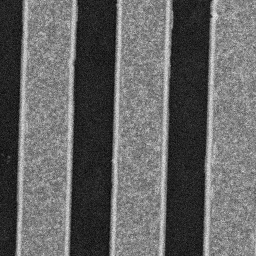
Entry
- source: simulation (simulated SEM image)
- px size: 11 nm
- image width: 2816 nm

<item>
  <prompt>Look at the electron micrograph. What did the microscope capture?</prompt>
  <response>one or a few lines or trenches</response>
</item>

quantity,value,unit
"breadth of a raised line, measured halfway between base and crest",524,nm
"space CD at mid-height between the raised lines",0.504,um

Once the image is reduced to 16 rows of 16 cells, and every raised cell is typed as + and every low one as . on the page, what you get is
..+++...++...+++
..+++...++...+++
..+++..+++...+++
..++...+++...+++
..++...+++...+++
.+++...+++...+++
.+++...+++...+++
.+++...+++...+++
.+++...+++...+++
.+++...+++...+++
.+++...+++...+++
.+++...+++...+++
.+++...+++...+++
.+++...+++...+++
.+++...+++...+++
.+++...+++...+++